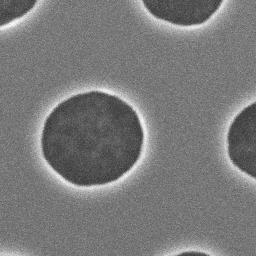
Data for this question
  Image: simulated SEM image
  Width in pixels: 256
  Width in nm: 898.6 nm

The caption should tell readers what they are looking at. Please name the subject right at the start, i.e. holes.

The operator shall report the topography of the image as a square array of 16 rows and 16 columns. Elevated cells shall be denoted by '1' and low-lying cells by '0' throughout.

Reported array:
0011111110000011
1111111111101111
1111111111111111
1111111111111111
1111111111111111
1111111111111111
1111000011111111
1110000001111110
1110000001111100
1110000001111100
1110000011111110
1111100111111111
1111111111111111
1111111111111111
1111111111111111
1111111111111111